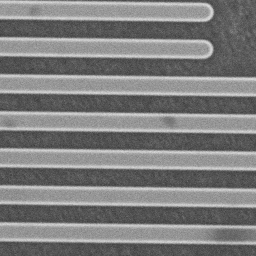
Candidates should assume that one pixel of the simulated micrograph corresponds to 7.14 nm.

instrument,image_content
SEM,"groups of lines, slits or small figures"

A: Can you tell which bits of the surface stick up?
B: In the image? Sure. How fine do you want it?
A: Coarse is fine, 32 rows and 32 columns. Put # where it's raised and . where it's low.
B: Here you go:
##########################......
###########################.....
.................#########......
................................
................................
##########################......
##########################......
................................
................................
#######.........................
################################
################################
................................
................................
################################
################################
...........................#####
................................
................................
################################
################################
................................
................................
##################..............
################################
.......#########################
................................
................................
################################
################################
................................
................................